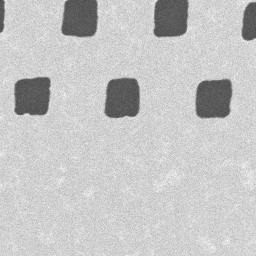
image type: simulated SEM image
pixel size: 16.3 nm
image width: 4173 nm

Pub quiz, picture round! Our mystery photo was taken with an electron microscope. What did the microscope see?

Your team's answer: holes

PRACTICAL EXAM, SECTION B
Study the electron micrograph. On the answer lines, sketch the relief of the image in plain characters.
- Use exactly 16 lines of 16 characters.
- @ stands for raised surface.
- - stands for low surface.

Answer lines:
@@@@--@@@@--@@@-
@@@@--@@@@--@@@-
@@@@@@@@@@@@@@@@
@@@@@@@@@@@@@@@@
@@@@@@@@@@@@@@@@
@--@@@@--@@@--@@
@--@@@@--@@@--@@
@@@@@@@@@@@@@@@@
@@@@@@@@@@@@@@@@
@@@@@@@@@@@@@@@@
@@@@@@@@@@@@@@@@
@@@@@@@@@@@@@@@@
@@@@@@@@@@@@@@@@
@@@@@@@@@@@@@@@@
@@@@@@@@@@@@@@@@
@@@@@@@@@@@@@@@@